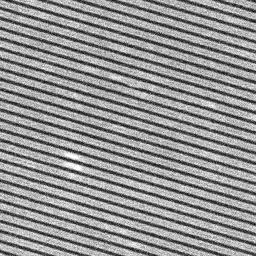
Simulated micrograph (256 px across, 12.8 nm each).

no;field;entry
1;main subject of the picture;parallel lines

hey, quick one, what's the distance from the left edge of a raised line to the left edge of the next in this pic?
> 9.73 pixels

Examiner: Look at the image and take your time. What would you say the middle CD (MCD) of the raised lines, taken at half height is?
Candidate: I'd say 5.29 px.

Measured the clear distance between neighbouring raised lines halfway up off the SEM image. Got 53.7 nanometres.